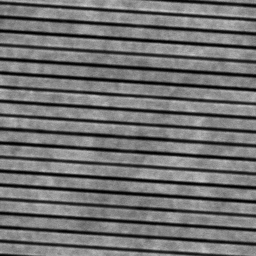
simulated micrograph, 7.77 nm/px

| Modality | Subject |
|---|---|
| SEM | parallel lines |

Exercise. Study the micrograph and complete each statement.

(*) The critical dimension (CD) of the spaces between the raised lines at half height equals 30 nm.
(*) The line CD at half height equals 81.4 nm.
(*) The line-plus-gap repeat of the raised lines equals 109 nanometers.